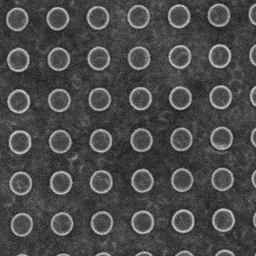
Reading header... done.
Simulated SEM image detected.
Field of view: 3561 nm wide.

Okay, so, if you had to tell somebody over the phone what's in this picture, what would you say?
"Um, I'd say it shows a regular array of raised bodies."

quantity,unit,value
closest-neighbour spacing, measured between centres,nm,560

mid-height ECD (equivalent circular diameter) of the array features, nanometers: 303